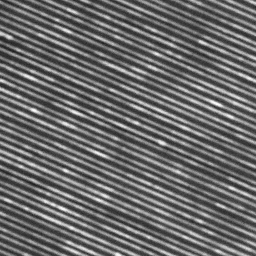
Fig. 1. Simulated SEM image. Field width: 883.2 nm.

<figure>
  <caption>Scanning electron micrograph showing parallel lines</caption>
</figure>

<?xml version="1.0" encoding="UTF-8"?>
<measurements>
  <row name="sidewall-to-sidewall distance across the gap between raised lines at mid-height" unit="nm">15.5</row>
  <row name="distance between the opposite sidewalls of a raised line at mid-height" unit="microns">0.0075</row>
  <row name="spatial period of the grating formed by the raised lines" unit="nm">24.6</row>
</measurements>